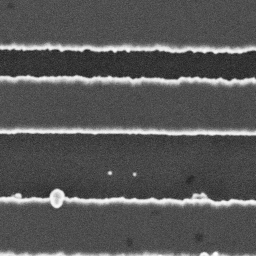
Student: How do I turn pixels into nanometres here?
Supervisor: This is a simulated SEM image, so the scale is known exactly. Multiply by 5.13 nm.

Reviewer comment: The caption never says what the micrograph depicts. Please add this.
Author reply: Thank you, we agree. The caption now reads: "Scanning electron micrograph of lines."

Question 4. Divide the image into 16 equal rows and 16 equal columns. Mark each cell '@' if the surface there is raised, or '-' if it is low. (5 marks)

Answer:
@@@@@@@@@@@@@@@@
@@@@@@@@@@@@@@@@
@@@@@@@@@@@@@@@@
----------------
----------------
@@@@@@@@@@@@@@@@
@@@@@@@@@@@@@@@@
@@@@@@@@@@@@@@@@
----------------
----------------
----------------
----------------
@@@@@@@@@@@-@---
@@@@@@@@@@@@@@@@
@@@@@@@@@@@@@@@@
@@@@@@@@@@@@@@@@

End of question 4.